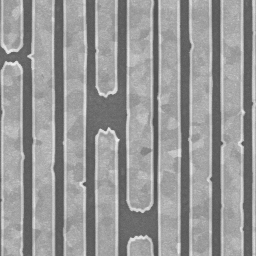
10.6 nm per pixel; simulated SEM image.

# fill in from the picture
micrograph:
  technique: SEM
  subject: parallel lines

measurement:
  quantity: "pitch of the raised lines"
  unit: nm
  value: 332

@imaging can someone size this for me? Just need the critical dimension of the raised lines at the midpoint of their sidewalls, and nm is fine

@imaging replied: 225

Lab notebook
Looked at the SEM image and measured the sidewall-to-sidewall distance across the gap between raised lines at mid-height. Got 0.108 micrometres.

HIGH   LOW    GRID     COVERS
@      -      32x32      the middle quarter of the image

@@@@@---@@@@@---@@@@@@--@@@@@---
@@@@@---@@@@@---@@@@@@--@@@@@---
@@@@@---@@@@@---@@@@@@--@@@@@---
@@@@@---@@@@@---@@@@@@--@@@@@---
@@@@@---@@@@@---@@@@@@--@@@@@---
@@@@@---@@@@@---@@@@@@--@@@@@---
@@@@@---@@@@@---@@@@@@--@@@@@---
@@@@@----@@-----@@@@@@--@@@@@---
@@@@@-----------@@@@@@--@@@@@---
@@@@@-----------@@@@@@--@@@@@---
@@@@@-----------@@@@@@--@@@@@---
@@@@@-----------@@@@@@--@@@@@---
@@@@@-----------@@@@@@--@@@@@---
@@@@@-----------@@@@@@--@@@@@---
@@@@@-----------@@@@@@--@@@@@---
@@@@@-----------@@@@@@--@@@@@---
@@@@@------@----@@@@@@--@@@@@---
@@@@@----@@@@---@@@@@@--@@@@@---
@@@@@---@@@@@---@@@@@@--@@@@@--@
@@@@@---@@@@@---@@@@@@--@@@@@---
@@@@@---@@@@@---@@@@@@--@@@@@---
@@@@@---@@@@@---@@@@@@--@@@@@---
@@@@@---@@@@@---@@@@@@--@@@@@---
@@@@@---@@@@@---@@@@@@--@@@@@---
@@@@@---@@@@@---@@@@@@--@@@@@---
@@@@@---@@@@@---@@@@@@--@@@@@---
@@@@@---@@@@@---@@@@@@--@@@@@---
@@@@@---@@@@@---@@@@@@--@@@@@---
@@@@@---@@@@@---@@@@@@--@@@@@---
@@@@@---@@@@@---@@@@@@--@@@@@---
@@@@@---@@@@@---@@@@@@--@@@@@---
@@@@@---@@@@@---@@@@@@--@@@@@---